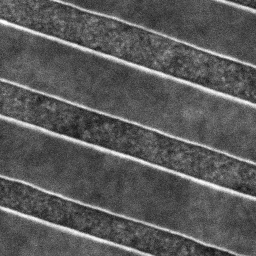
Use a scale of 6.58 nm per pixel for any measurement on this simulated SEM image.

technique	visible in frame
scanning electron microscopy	lines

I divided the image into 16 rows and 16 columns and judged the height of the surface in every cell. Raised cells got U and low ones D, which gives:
DDDDDUUUUUUUUUUU
UDDDDDDDUUUUUUUU
UUUUDDDDDDDUUUUU
UUUUUUUDDDDDDDUU
UUUUUUUUUUDDDDDD
DDUUUUUUUUUUUDDD
DDDDDUUUUUUUUUUU
UDDDDDDDUUUUUUUU
UUUUDDDDDDDUUUUU
UUUUUUUDDDDDDDUU
UUUUUUUUUUDDDDDD
DDUUUUUUUUUUUDDD
DDDDUUUUUUUUUUUU
UUDDDDDUUUUUUUUU
UUUUUDDDDDDUUUUU
UUUUUUUUDDDDDDUU